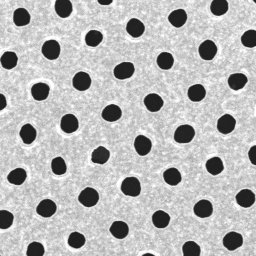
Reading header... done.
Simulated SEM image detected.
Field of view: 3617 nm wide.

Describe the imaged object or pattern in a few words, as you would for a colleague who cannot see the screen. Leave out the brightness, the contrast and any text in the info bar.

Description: a regular array of holes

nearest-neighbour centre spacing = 607 nm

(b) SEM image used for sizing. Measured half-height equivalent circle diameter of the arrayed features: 262 nanometres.